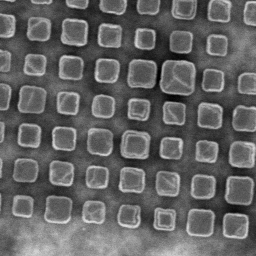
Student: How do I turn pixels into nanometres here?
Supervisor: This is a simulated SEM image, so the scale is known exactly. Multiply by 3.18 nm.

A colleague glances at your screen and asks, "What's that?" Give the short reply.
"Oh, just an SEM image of a regular array of raised bodies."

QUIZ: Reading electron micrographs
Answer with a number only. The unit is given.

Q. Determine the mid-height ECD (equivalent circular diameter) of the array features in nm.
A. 80.1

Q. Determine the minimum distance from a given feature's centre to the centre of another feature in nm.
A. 112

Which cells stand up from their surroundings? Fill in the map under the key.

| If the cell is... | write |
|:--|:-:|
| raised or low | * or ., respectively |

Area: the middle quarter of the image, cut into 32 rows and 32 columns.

*****...******..*******..*******
****....******..*******.********
****....*****...*******.********
****....*****...*******.********
...........*....*******.********
.................*****..********
........................********
***..........................**.
****....****....................
****...*****....*****...........
****...*****....*****....*****..
***....*****....*****....*****..
***....*****....*****....*****..
.................****....*****..
.........................*****..
................................
***...***.......................
***...******...******...........
***...******...******...........
***...******...******...******..
***...******..*******...******..
**....******..*******...*****...
........***....******...*****...
.................*.*.....****...
................................
**..............................
**....*****...******............
**....*****...******....****....
**....*****...******...******...
**....*****...******...******...
*.....*****...******...******...
..............******...*****....